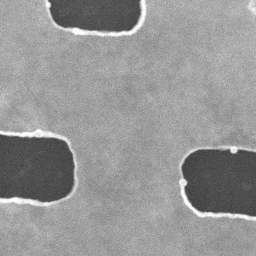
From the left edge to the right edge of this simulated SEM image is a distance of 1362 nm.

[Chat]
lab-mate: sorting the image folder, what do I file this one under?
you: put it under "holes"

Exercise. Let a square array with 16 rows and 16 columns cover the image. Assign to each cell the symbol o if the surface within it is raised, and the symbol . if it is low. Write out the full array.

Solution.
ooo......ooooooo
oooo.....ooooooo
oooooooooooooooo
oooooooooooooooo
oooooooooooooooo
oooooooooooooooo
oooooooooooooooo
oooooooooooooooo
.ooooooooooooooo
....oooooooo....
.....oooooo.....
.....ooooooo....
oo..oooooooo....
oooooooooooooooo
oooooooooooooooo
oooooooooooooooo